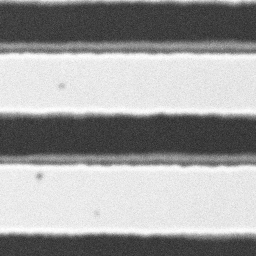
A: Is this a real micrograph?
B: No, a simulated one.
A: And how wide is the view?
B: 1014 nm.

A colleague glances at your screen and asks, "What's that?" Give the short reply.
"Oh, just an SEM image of lines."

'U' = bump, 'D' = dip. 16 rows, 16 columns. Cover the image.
DDDDDDDDDDDDDDDD
DDDDDDDDDDDDDDDD
DDDDDDDDDDDDDDDD
UUUUUUUUUUUUUUUU
UUUUUUUUUUUUUUUU
UUUUUUUUUUUUUUUU
UUUUUUUUUUUUUUUU
DDDDDDDDDDDDDDDD
DDDDDDDDDDDDDDDD
DDDDDDDDDDDDDDDD
UUUUUUUUUUUUUUUU
UUUUUUUUUUUUUUUU
UUUUUUUUUUUUUUUU
UUUUUUUUUUUUUUUU
DUUUUUDUUUUUUUUU
DDDDDDDDDDDDDDDD